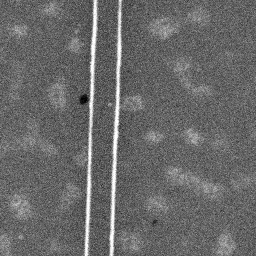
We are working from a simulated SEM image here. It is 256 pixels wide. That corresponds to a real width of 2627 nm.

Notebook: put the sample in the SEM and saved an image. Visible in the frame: one or a few lines or trenches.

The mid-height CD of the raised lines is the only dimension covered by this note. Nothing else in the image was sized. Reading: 25.5 pixels